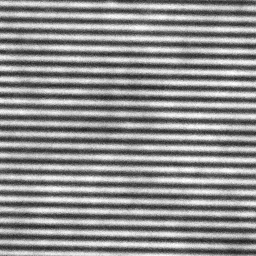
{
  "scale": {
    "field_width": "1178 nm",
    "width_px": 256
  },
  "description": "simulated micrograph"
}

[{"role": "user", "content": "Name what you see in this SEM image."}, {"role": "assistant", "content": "parallel lines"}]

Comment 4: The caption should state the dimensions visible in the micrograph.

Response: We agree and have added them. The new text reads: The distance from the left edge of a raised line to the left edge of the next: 49.8 nanometres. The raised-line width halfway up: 19.5 nm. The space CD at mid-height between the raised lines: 30.5 nm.